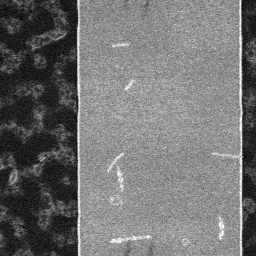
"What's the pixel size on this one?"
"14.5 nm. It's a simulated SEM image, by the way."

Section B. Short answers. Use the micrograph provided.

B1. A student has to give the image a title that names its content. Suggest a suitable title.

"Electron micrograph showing one or a few lines or trenches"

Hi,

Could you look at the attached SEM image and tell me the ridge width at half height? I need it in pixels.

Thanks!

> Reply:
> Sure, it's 162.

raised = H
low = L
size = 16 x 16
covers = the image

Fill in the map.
LLLLLHHHHHHHHHHL
LLLLLHHHHHHHHHHL
LLLLLHHHHHHHHHHL
LLLLLHHHHHHHHHHL
LLLLLHHHHHHHHHHL
LLLLLHHHHHHHHHHL
LLLLLHHHHHHHHHHL
LLLLLHHHHHHHHHHL
LLLLLHHHHHHHHHHL
LLLLLHHHHHHHHHHL
LLLLLHHHHHHHHHHL
LLLLLHHHHHHHHHHL
LLLLLHHHHHHHHHHL
LLLLLHHHHHHHHHHL
LLLLLHHHHHHHHHHL
LLLLLHHHHHHHHHHL